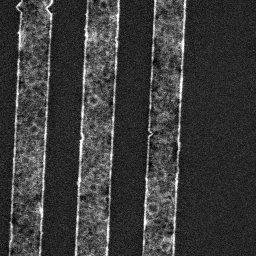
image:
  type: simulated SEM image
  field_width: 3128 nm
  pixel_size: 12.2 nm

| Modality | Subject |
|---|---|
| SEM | one or a few lines or trenches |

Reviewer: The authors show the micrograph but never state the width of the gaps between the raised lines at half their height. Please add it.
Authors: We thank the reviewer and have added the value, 430 nanometers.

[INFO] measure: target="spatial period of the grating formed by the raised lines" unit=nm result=815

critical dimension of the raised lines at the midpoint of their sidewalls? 378 nanometers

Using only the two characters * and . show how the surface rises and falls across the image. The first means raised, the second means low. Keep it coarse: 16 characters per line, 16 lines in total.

.**..**...**....
.**..**...**....
.**..**...*.....
.**..**...*.....
.**..**..**.....
.**..**..**.....
.**..**..**.....
.**..**..**.....
.**..**..**.....
.**..**..**.....
.**..**..**.....
.**..**..**.....
.**..**..**.....
.**..**..**.....
.**..**..**.....
.**..**..**.....